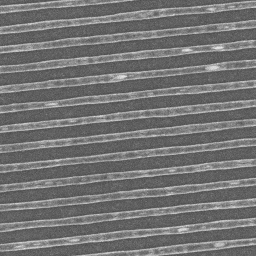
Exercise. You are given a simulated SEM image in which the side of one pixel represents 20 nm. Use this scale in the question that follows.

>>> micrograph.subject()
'parallel lines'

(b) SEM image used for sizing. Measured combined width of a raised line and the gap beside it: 0.394 microns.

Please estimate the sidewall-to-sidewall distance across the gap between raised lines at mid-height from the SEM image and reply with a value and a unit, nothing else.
0.246 microns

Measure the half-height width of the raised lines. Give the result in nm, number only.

149